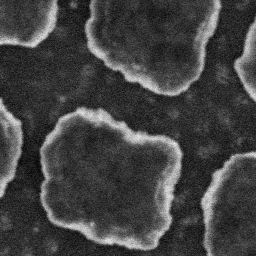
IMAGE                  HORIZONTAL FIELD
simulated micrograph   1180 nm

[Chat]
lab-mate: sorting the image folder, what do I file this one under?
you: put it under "raised bodies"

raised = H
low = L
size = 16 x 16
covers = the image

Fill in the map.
HHHLLLHHHHHHHHLL
HHHLLHHHHHHHHLLL
HHLLLHHHHHHHHLLH
LLLLLLHHHHHHHLLH
LLLLLLLHHHHHHLLH
LLLLLLLLLHHHLLLH
LLLLLLLLLLLLLLLL
HLLLHHHLLLLLLLLL
HLLHHHHHHLLLLLLL
HLLHHHHHHHHLLLLL
HLLHHHHHHHHLLLHH
LLLHHHHHHHHLLHHH
LLLHHHHHHHHLLHHH
LLLHHHHHHHHLLHHH
LLLLLHHHHHLLLHHH
LLLLLLLLLLLLLHHH